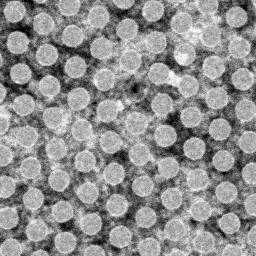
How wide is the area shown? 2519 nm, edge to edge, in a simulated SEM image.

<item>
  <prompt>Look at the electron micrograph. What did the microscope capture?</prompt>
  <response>a regular array of raised bodies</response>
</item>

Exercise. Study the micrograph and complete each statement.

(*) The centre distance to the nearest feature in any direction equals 307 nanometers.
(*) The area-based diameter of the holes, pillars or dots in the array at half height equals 0.202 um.